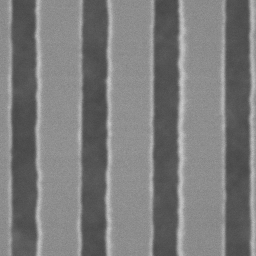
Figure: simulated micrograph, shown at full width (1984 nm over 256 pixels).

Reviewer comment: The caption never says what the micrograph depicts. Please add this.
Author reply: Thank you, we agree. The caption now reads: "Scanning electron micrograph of lines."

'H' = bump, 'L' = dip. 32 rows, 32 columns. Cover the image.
HLLLLHHHHHLLLHHHHHHLLLHHHHHHLLLH
HLLLHHHHHHLLLLHHHHHLLLHHHHHHLLLH
HLLLLHHHHHLLLLHHHHHLLLHHHHHHLLLH
HLLLLHHHHHLLLLHHHHHLLLHHHHHHLLLH
HLLLHHHHHHLLLLHHHHHLLLHHHHHHLLLH
HLLLLHHHHHLLLLHHHHHLLLHHHHHHLLLH
HLLLLHHHHHLLLHHHHHHLLLHHHHHHLLLH
HLLLLHHHHHLLLHHHHHHLLLHHHHHHLLLH
HLLLLHHHHHLLLLHHHHHLLLHHHHHHLLLH
HLLLLHHHHHLLLHHHHHHLLLHHHHHHLLLH
HLLLLHHHHHLLLHHHHHHLLLHHHHHHLLLH
HLLLLHHHHHLLLHHHHHHLLLHHHHHHLLLH
HLLLLHHHHHLLLHHHHHHLLLHHHHHHLLLH
HLLLLHHHHHLLLLHHHHHLLLHHHHHHLLLH
HLLLLHHHHHLLLLHHHHHLLLHHHHHHLLLH
HLLLLHHHHHLLLHHHHHHLLLHHHHHHLLLH
HLLLHHHHHHLLLLHHHHHLLLHHHHHHLLLH
HLLLLHHHHHLLLHHHHHHLLLHHHHHHLLLH
HLLLLHHHHHLLLHHHHHHLLLHHHHHHLLLH
HLLLLHHHHHLLLLHHHHHLLLHHHHHHLLLH
HLLLLHHHHHLLLLHHHHHLLLHHHHHHLLLH
HLLLLHHHHHLLLHHHHHHLLLHHHHHHLLLH
HLLLLHHHHHLLLHHHHHHLLLHHHHHHLLLH
HLLLLHHHHHLLLHHHHHHLLLHHHHHHLLLH
HLLLLHHHHHLLLHHHHHHLLLHHHHHHLLLH
HLLLLHHHHHLLLHHHHHHLLLHHHHHHLLLH
HLLLLHHHHHLLLHHHHHHLLLHHHHHHLLLH
HLLLLHHHHHLLLHHHHHHLLLHHHHHHLLLH
HLLLLHHHHHLLLHHHHHHLLLHHHHHHLLLH
HLLLLHHHHHLLLHHHHHHLLLHHHHHHLLLH
HLLLLHHHHHLLLHHHHHHLLLHHHHHHLLLH
HLLLLHHHHHLLLHHHHHHLLLHHHHHHLLLH